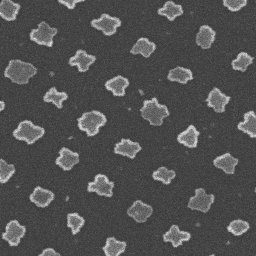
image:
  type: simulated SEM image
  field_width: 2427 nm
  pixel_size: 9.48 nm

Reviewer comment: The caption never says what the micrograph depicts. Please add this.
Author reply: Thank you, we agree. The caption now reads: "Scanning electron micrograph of a regular array of raised bodies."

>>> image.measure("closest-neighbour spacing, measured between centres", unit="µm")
0.414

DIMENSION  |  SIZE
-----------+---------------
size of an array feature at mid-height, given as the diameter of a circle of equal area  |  197 nanometres